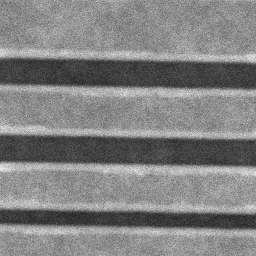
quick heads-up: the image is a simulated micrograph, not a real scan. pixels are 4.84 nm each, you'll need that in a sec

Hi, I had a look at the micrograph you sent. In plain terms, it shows one or a few lines or trenches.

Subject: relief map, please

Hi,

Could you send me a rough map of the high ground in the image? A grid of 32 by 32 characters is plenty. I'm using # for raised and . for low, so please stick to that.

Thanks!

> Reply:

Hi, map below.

################################
################################
################################
################################
################################
################################
################################
...............................#
................................
................................
................................
############################....
################################
################################
################################
################################
...#############################
................................
................................
................................
................................
################################
################################
################################
################################
################################
................................
................................
#...............................
################################
################################
################################